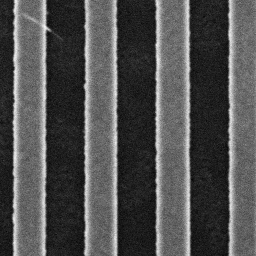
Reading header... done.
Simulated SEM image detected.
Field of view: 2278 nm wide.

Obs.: lines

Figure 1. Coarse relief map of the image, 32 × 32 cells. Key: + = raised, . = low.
..++++.....++++....+++++.....+++
..++++.....++++....+++++.....+++
..++++.....++++....+++++.....+++
..++++.....++++.....++++.....+++
..++++.....++++.....++++.....+++
..++++.....+++.....+++++.....+++
..++++.....++++....+++++.....+++
..++++.....++++....+++++.....+++
..++++.....++++.....++++.....+++
..++++.....++++....+++++.....+++
..++++.....++++....+++++.....+++
..++++.....++++....+++++.....+++
..++++.....++++....+++++.....+++
..++++.....++++....+++++.....+++
..++++.....++++....+++++.....+++
..++++.....++++....+++++.....+++
..++++.....++++....+++++.....+++
..++++.....++++....+++++.....+++
..++++.....++++....+++++.....+++
..++++.....++++....+++++.....+++
..++++.....++++....+++++.....+++
..++++.....++++.....++++.....+++
..++++.....++++....+++++.....+++
..++++.....++++....+++++.....+++
..++++.....++++.....++++.....+++
..++++.....++++.....++++.....+++
..++++.....++++....+++++.....+++
..++++.....++++....+++++.....+++
..++++.....++++....+++++.....+++
..++++.....++++.....++++.....+++
..++++.....++++....+++++.....+++
..++++.....++++....+++++.....+++